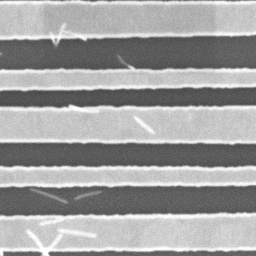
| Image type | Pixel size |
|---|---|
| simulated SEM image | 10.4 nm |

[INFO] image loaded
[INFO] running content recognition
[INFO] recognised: lines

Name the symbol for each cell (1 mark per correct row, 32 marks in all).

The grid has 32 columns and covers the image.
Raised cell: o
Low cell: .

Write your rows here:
oooooooooooooooooooooooooooooooo
oooooooooooooooooooooooooooooooo
oooooooooooooooooooooooooooooooo
oooooooooooooooooooooooooooooooo
ooooooooooooooooooo.............
................................
................................
................................
................................
oooooooooooooooooooooooooooooooo
oooooooooooooooooooooooooooooooo
................................
................................
........oo..oooooo.ooooooooooooo
oooooooooooooooooooooooooooooooo
oooooooooooooooooooooooooooooooo
oooooooooooooooooooooooooooooooo
oooooooooooooooooooooooooooooooo
................................
................................
................................
oooooooooooooooooooooooooooooooo
oooooooooooooooooooooooooooooooo
................................
................................
................................
................................
oooooooooooooooooooooooooooooooo
oooooooooooooooooooooooooooooooo
oooooooooooooooooooooooooooooooo
oooooooooooooooooooooooooooooooo
.....o..........................